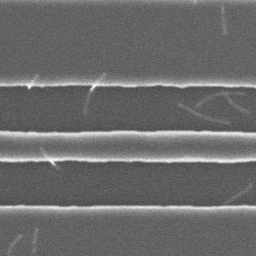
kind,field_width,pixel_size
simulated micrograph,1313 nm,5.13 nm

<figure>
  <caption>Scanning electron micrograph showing lines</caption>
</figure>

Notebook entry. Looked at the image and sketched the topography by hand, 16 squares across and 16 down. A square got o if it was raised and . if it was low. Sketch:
oooooooooooooooo
oooooooooooooooo
oooooooooooooooo
oooooooooooooooo
oooooooooooooooo
................
................
................
oooooooooooooooo
oooooooooooooooo
................
................
................
oooooooooooooooo
oooooooooooooooo
oooooooooooooooo